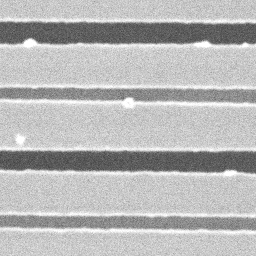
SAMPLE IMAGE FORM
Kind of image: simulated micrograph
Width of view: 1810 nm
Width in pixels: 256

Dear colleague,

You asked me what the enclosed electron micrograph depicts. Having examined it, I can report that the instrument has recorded lines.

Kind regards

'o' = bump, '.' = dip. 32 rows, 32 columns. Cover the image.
oooooooooooooooooooooooooooooooo
oooooooooooooooooooooooooooooooo
oooooooooooooooooooooooooooooooo
................................
................................
...oo....oo.............oo......
oooooooooooooooooooooooooooooooo
oooooooooooooooooooooooooooooooo
oooooooooooooooooooooooooooooooo
oooooooooooooooooooooooooooooooo
oooooooooooooooooooooooooooooooo
oooooooooooooooooooooooooooooooo
oooooooooooooooooooooooooooooooo
oooooooooooooooooooooooooooooooo
oooooooooooooooooooooooooooooooo
oooooooooooooooooooooooooooooooo
oooooooooooooooooooooooooooooooo
oooooooooooooooooooooooooooooooo
oooooooooooooooooooooooooooooooo
................................
................................
ooooooo.oo..................o...
oooooooooooooooooooooooooooooooo
oooooooooooooooooooooooooooooooo
oooooooooooooooooooooooooooooooo
oooooooooooooooooooooooooooooooo
oooooooooooooooooooooooooooooooo
oooooooooooooooooooooooooooooooo
oooooooooooooooooooooooooooooooo
oooooooooooooooooooooooooooooooo
oooooooooooooooooooooooooooooooo
oooooooooooooooooooooooooooooooo